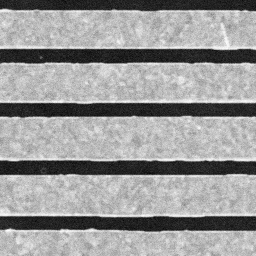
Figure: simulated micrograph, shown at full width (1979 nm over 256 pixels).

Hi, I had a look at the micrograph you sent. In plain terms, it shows lines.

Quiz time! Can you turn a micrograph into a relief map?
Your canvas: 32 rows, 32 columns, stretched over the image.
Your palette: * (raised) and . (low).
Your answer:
................................
********************************
********************************
********************************
********************************
********************************
................................
................................
********************************
********************************
********************************
********************************
********************************
................................
................................
********************************
********************************
********************************
********************************
********************************
................................
................................
********************************
********************************
********************************
********************************
********************************
................................
................................
********************************
********************************
********************************